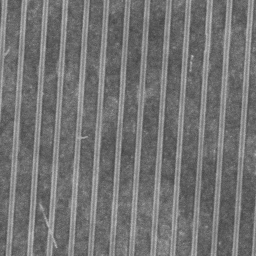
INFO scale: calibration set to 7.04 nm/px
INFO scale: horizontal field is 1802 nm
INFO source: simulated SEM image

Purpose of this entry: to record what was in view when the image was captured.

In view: parallel lines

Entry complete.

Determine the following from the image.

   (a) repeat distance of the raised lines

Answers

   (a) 0.145 µm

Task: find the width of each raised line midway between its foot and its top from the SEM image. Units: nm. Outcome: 25.5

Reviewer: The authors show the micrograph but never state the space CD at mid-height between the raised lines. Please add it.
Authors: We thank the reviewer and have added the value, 120 nm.